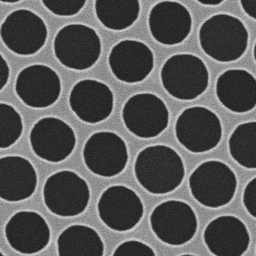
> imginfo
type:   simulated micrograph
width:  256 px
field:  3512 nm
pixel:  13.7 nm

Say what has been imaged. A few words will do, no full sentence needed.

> a regular array of holes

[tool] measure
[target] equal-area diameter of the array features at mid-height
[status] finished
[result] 622 nanometres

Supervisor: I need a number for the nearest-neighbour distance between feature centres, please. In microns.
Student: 0.753